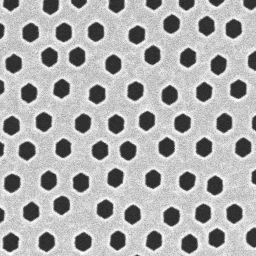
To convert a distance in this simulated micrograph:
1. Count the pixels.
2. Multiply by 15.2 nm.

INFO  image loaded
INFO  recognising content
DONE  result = a regular array of holes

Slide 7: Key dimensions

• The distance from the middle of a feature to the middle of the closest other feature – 0.458 µm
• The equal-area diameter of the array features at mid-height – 18.5 pixels